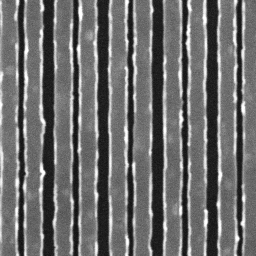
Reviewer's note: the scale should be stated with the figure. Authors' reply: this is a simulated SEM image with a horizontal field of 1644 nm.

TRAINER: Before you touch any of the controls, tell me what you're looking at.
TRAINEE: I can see parallel lines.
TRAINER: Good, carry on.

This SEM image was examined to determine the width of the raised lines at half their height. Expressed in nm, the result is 120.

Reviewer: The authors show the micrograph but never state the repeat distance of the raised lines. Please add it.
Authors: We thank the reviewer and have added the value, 178 nm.